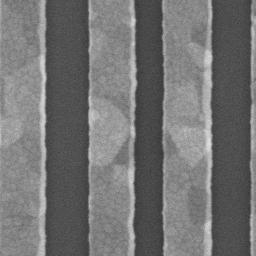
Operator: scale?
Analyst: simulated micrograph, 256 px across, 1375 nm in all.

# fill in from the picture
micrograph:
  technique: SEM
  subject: lines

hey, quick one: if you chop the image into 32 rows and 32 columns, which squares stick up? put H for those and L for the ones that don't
HHHHHLLLLLLHHHHHHLLLHHHHHHLLLLLH
HHHHHLLLLLLHHHHHHLLLHHHHHHLLLLLH
HHHHHLLLLLLHHHHHHLLLHHHHHHLLLLLH
HHHHHLLLLLLHHHHHHLLLHHHHHHLLLLLH
HHHHHLLLLLLHHHHHHLLLHHHHHHLLLLLH
HHHHHLLLLLLHHHHHHLLLHHHHHHLLLLLH
HHHHHLLLLLLHHHHHHLLLHHHHHHLLLLLH
HHHHHLLLLLLHHHHHHLLLHHHHHHLLLLLH
HHHHHLLLLLLHHHHHHLLLHHHHHHLLLLLH
HHHHHHLLLLLHHHHHHLLLLHHHHHLLLLLH
HHHHHLLLLLLHHHHHHLLLLHHHHHLLLLLH
HHHHHLLLLLLHHHHHHLLLLHHHHHLLLLLH
HHHHHLLLLLLHHHHHHLLLHHHHHHLLLLLH
HHHHHLLLLLLHHHHHHLLLHHHHHHLLLLLH
HHHHHLLLLLLHHHHHHLLLHHHHHHLLLLLH
HHHHHLLLLLLHHHHHHLLLHHHHHHLLLLLH
HHHHHLLLLLLHHHHHHLLLHHHHHHLLLLLH
HHHHHLLLLLLHHHHHHLLLHHHHHHLLLLLH
HHHHHLLLLLLHHHHHLLLLHHHHHHLLLLLH
HHHHHLLLLLLHHHHHLLLLLHHHHHLLLLLH
HHHHHLLLLLLHHHHHHLLLHHHHHHLLLLLH
HHHHHLLLLLLHHHHHHLLLHHHHHHLLLLLH
HHHHHLLLLLLHHHHHLLLLHHHHHHLLLLLH
HHHHHLLLLLLHHHHHLLLLHHHHHHLLLLLH
HHHHHLLLLLLHHHHHHLLLHHHHHHLLLLLH
HHHHHLLLLLLHHHHHHLLLHHHHHHLLLLLH
HHHHHLLLLLLHHHHHHLLLHHHHHHLLLLLH
HHHHHLLLLLLHHHHHLLLLHHHHHHLLLLLH
HHHHHLLLLLLHHHHHLLLLHHHHHHLLLLLH
HHHHHLLLLLLHHHHHHLLLLHHHHHLLLLLH
HHHHHLLLLLLHHHHHHLLLLHHHHHLLLLLH
HHHHHLLLLLLHHHHHLLLLHHHHHHLLLLLH